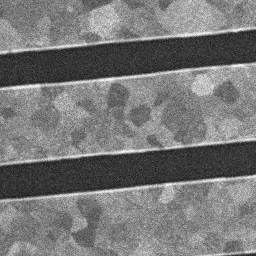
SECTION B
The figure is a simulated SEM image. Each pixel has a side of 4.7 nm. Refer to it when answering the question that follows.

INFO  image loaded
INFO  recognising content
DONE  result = one or a few lines or trenches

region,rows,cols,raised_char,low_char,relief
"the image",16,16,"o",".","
oooooooooooooooo
oooooooooooooooo
oooooooo........
................
...........ooooo
.ooooooooooooooo
oooooooooooooooo
oooooooooooooooo
oooooooooooooooo
oooooooo........
................
...........ooooo
.ooooooooooooooo
oooooooooooooooo
oooooooooooooooo
oooooooooooooooo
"